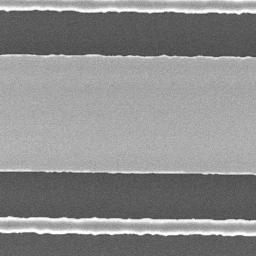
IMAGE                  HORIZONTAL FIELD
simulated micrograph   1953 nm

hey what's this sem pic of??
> lines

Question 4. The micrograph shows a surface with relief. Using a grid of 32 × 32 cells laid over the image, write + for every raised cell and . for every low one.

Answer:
++++++++++++++++++++++++++++++++
.......................+++..++++
................................
................................
................................
................................
................................
++++++++++++++++++++++++++++++++
++++++++++++++++++++++++++++++++
++++++++++++++++++++++++++++++++
++++++++++++++++++++++++++++++++
++++++++++++++++++++++++++++++++
++++++++++++++++++++++++++++++++
++++++++++++++++++++++++++++++++
++++++++++++++++++++++++++++++++
++++++++++++++++++++++++++++++++
++++++++++++++++++++++++++++++++
++++++++++++++++++++++++++++++++
++++++++++++++++++++++++++++++++
++++++++++++++++++++++++++++++++
++++++++++++++++++++++++++++++++
.............+++++++++++++++++++
................................
................................
................................
................................
................................
++++++++++++++++++++++.++++.++..
++++++++++++++++++++++++++++++++
................................
................................
................................